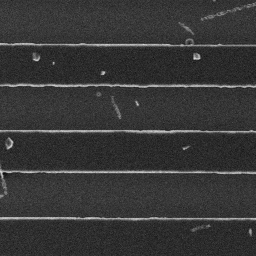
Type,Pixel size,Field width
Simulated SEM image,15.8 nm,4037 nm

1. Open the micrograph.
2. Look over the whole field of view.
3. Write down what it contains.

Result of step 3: lines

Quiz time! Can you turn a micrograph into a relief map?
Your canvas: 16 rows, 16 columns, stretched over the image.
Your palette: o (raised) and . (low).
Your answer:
................
................
................
oooooooooooooooo
oooooooooooooooo
................
................
................
oooooooooooooooo
oooooooooooooooo
oooooooooooooooo
................
................
................
oooooooooooooooo
oooooooooooooooo